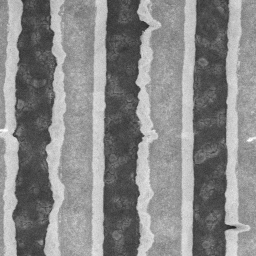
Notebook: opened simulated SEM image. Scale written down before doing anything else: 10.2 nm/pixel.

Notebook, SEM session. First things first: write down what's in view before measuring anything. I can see one or a few lines or trenches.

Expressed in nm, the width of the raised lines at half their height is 437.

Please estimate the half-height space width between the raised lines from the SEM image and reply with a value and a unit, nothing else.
473 nm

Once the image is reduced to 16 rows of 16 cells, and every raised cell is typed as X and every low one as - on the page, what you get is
X---XX---XXX---X
X--XXX---XXX---X
X---XX---XXX---X
X---XX---XXX---X
X---XX---XXX---X
X---XX---XXX---X
X---XX---XXX--XX
X---XX---XXX---X
X---XX---XXX---X
X--XXX---XXX---X
X--XXX---XXX--XX
X---XX---XXX---X
X---XX---XXX---X
X--XXX---XXX---X
X--XXX---XXX---X
X--XXX---XXX---X